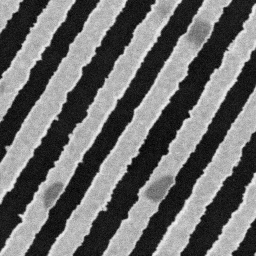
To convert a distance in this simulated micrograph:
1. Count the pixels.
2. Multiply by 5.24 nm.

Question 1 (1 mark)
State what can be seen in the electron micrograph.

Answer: lines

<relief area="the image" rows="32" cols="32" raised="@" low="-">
@@----@@@---@@@@---@@@---@@@@---
@@---@@@----@@@----@@@---@@@----
@----@@@---@@@----@@@---@@@----@
----@@@---@@@@---@@@----@@@---@@
----@@----@@@----@@@---@@@----@@
---@@@---@@@----@@@---@@@----@@@
--@@@----@@@----@@----@@@---@@@-
--@@@---@@@----@@@---@@@----@@@-
-@@@---@@@----@@@---@@@----@@@--
@@@----@@@----@@@---@@@---@@@@--
@@@---@@@----@@@---@@@----@@@---
@@----@@@---@@@----@@@---@@@----
@@---@@@----@@@---@@@----@@@---@
@---@@@@---@@@---@@@----@@@---@@
@--@@@@----@@----@@@----@@@---@@
---@@@----@@@---@@@----@@@---@@@
--@@@@---@@@----@@@---@@@@---@@@
--@@@----@@@---@@@----@@@---@@@-
-@@@----@@@---@@@----@@@---@@@--
-@@@----@@----@@@----@@@---@@@--
@@@----@@@---@@@----@@@---@@@---
@@----@@@---@@@@---@@@----@@@---
@@----@@@---@@@----@@@---@@@----
@----@@@---@@@----@@@---@@@----@
----@@@----@@@---@@@@---@@@---@@
----@@@---@@@----@@@---@@@----@@
---@@@---@@@----@@@----@@----@@@
---@@@---@@@----@@@---@@@----@@@
--@@@---@@@----@@@---@@@----@@@-
-@@@---@@@@---@@@@---@@@----@@--
-@@@---@@@----@@@---@@@----@@@--
@@@---@@@----@@@---@@@@---@@@---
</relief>